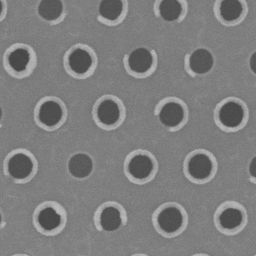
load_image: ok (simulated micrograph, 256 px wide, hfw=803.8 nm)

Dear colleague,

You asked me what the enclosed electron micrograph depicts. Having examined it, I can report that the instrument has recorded a regular array of holes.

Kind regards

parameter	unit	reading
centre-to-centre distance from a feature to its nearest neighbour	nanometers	187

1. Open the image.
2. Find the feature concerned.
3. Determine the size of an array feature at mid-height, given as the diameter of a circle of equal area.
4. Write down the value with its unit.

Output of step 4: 76.1 nanometres